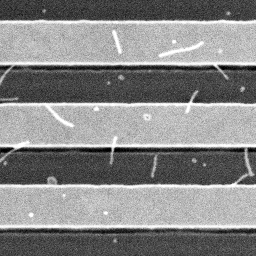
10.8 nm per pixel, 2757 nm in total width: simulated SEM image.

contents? lines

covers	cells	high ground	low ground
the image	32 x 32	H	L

LLLLLLLLLLLLLLLLLLLLLLLLLLLLLLLL
LLLLLLLLLLLLLLLLLLLLLLLLLLLLLLLL
LLLLLLLLLLLLLLLLLLLLLLLLLLLLLLLL
HHHHHHHHHHHHHHHHHHHHHHHHHHHHHHHH
HHHHHHHHHHHHHHHHHHHHHHHHHHHHHHHH
HHHHHHHHHHHHHHHHHHHHHHHHHHHHHHHH
HHHHHHHHHHHHHHHHHHHHHHHHHHHHHHHH
HHHHHHHHHHHHHHHHHHHHHHHHHHHHHHHH
LLLLLLLLLLLLLLLLLLLLLLLLLLLLLLLL
LLLLLLLLLLLLLLLLLLLLLLLLLLLLLLLL
LLLLLLLLLLLLLLLLLLLLLLLLLLLLLLLL
LLLLLLLLLLLLLLLLLLLLLLLLLLLLLLLL
LLLLLLLLLLLLLLLLLLLLLLLLLLLLLLLL
HHHHHHHHHHHHHHHHHHHHHHHHHHHHHHHH
HHHHHHHHHHHHHHHHHHHHHHHHHHHHHHHH
HHHHHHHHHHHHHHHHHHHHHHHHHHHHHHHH
HHHHHHHHHHHHHHHHHHHHHHHHHHHHHHHH
HHHHHHHHHHHHHHHHHHHHHHHHHHHHHHHH
LLLLLLLLLLLLLLLLLLLLLLLLLLLLLLLL
LLLLLLLLLLLLLLLLLLLLLLLLLLLLLLLL
LLLLLLLLLLLLLLLLLLLLLLLLLLLLLLLL
LLLLLLLLLLLLLLLLLLLLLLLLLLLLLLLL
LLLLLLLLLLLLLLLLLLLLLLLLLLLLLLLL
HHHHHHHHHHHHHHHHHHHHHHHHHHHHHHHH
HHHHHHHHHHHHHHHHHHHHHHHHHHHHHHHH
HHHHHHHHHHHHHHHHHHHHHHHHHHHHHHHH
HHHHHHHHHHHHHHHHHHHHHHHHHHHHHHHH
HHHHHHHHHHHHHHHHHHHHHHHHHHHHHHHH
LLLLLLLLLLLLLLLLLLLLLLLLLLLLLLLL
LLLLLLLLLLLLLLLLLLLLLLLLLLLLLLLL
LLLLLLLLLLLLLLLLLLLLLLLLLLLLLLLL
LLLLLLLLLLLLLLLLLLLLLLLLLLLLLLLL